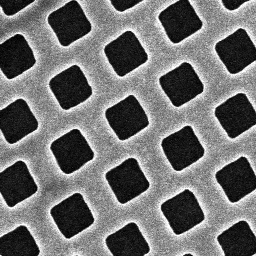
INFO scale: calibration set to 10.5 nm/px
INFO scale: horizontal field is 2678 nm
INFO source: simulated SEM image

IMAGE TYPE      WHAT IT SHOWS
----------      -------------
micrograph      a regular array of holes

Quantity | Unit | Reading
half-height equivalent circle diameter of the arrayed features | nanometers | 421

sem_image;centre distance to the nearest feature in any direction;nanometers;664